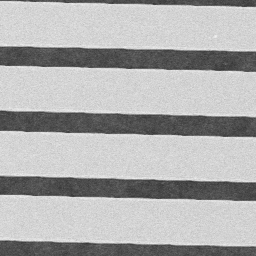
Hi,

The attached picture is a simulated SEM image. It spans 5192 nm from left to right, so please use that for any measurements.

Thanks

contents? lines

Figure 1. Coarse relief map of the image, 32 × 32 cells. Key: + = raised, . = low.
++++++++++++++..................
++++++++++++++++++++++++++++++++
++++++++++++++++++++++++++++++++
++++++++++++++++++++++++++++++++
++++++++++++++++++++++++++++++++
++++++++++++++++++++++++++++++++
................................
................................
+++++++++++.....................
++++++++++++++++++++++++++++++++
++++++++++++++++++++++++++++++++
++++++++++++++++++++++++++++++++
++++++++++++++++++++++++++++++++
++++++++++++++++++++++++++++++++
...............................+
................................
+++.............................
++++++++++++++++++++++++++++++++
++++++++++++++++++++++++++++++++
++++++++++++++++++++++++++++++++
++++++++++++++++++++++++++++++++
++++++++++++++++++++++++++++++++
........................++++++++
................................
++++............................
++++++++++++++++++++++++++++++++
++++++++++++++++++++++++++++++++
++++++++++++++++++++++++++++++++
++++++++++++++++++++++++++++++++
++++++++++++++++++++++++++++++++
.....................+++++++++++
................................